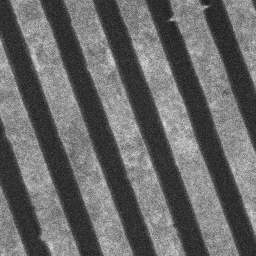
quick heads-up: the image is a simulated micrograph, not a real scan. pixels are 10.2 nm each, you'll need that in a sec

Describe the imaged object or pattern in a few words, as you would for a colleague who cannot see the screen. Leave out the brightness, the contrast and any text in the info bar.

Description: parallel lines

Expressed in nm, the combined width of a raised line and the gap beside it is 509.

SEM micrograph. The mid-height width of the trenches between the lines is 217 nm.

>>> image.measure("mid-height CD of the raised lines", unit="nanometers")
296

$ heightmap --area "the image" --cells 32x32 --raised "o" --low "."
.oooo...oooo...ooo...oooo...oooo
..oooo..oooo...oooo...oooo..oooo
..oooo...ooo...oooo...oooo...ooo
..ooooo..oooo...oooo..oooo...ooo
...oooo...ooo...oooo...oooo..ooo
...oooo...oooo..oooo...oooo...oo
o...oooo..oooo...oooo..oooo...oo
o...oooo...ooo...oooo...oooo..oo
o...oooo...oooo...ooo...oooo...o
oo...oooo..oooo...oooo...oooo..o
oo...oooo...ooo...oooo...oooo...
ooo..oooo...oooo...ooo...oooo...
ooo...oooo..oooo...oooo...oooo..
ooo...oooo...oooo..oooo...oooo..
oooo..oooo...oooo...oooo..oooo..
oooo...oooo...ooo...oooo...oooo.
.ooo...oooo...oooo...ooo...oooo.
.oooo..oooo...oooo...oooo..oooo.
.oooo...oooo...ooo...oooo...oooo
..ooo...oooo...oooo...ooo...oooo
..oooo...oooo..oooo...oooo..oooo
...ooo...oooo...oooo..oooo...ooo
...oooo..oooo...oooo...oooo..ooo
...oooo...oooo..oooo...oooo...oo
o...ooo...oooo...oooo...ooo...oo
o...oooo...ooo...oooo...oooo..oo
o...oooo...oooo...ooo...oooo...o
oo...ooo...oooo...oooo..oooo...o
oo...oooo...ooo...oooo...oooo...
ooo..oooo...oooo...ooo...oooo...
ooo...oooo..oooo...oooo...ooo...
ooo...oooo...oooo..oooo...oooo..